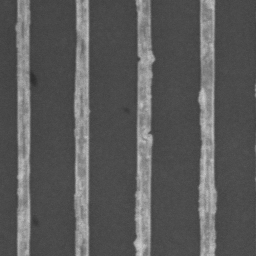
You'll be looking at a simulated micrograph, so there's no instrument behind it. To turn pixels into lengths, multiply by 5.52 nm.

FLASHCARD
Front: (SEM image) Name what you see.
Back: one or a few lines or trenches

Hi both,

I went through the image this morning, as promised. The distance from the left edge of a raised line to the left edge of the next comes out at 61.3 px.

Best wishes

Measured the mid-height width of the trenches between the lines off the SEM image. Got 270 nanometers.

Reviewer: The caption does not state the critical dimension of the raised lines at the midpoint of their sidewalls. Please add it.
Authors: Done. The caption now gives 68.9 nanometres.